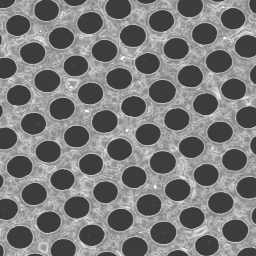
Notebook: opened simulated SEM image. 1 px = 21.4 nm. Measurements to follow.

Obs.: a regular array of holes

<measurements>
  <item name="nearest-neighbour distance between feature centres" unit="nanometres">670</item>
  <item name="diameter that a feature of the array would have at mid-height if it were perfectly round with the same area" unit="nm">500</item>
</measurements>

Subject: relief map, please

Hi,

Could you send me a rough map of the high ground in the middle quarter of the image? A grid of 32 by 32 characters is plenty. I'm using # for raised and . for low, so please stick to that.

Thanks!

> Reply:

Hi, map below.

......############......#######.
......######....###....######...
#....######......###..#######...
###########......###########....
###########......######....##...
####.....##.....######......##..
####......###########.......####
###.......###########.......####
####......######...###.....#####
..##....#######.....###...######
...###########.......###########
...###########......#######...##
..######.....##.....#####......#
.######......############......#
#######......############......#
##..###......######....###.....#
#.....##....######......###..###
......############......########
......############......#######.
......######....###....######...
#....######......############...
###########......############...
######.####......######....##...
#####....###....######......###.
####......###########.......####
####......#######.####......####
.###.....######.....##.....#####
..###...#######......###########
...###########.......###########
...######..####.....######.....#
..######.....###...######......#
#######......############.......